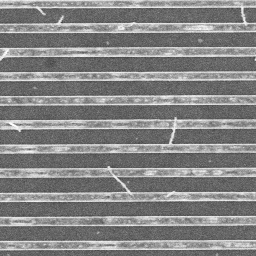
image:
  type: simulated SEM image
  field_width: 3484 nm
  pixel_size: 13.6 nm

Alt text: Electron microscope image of parallel lines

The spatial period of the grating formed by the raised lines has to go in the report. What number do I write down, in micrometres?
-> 0.329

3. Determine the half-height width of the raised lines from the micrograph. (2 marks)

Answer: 119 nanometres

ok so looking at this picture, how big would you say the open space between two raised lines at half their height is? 216 nm